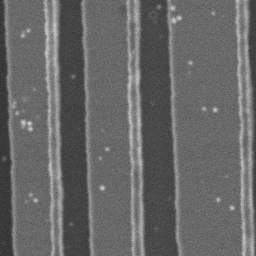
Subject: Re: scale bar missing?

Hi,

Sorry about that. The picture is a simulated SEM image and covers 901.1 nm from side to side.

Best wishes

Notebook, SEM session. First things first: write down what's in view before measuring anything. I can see lines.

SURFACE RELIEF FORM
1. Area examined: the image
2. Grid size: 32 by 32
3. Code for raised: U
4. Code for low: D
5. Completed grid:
DUUUUUUDDDUUUUUUUDDDDUUUUUUUUUUD
DUUUUUUDDDUUUUUUUDDDDUUUUUUUUUUD
DUUUUUUDDDUUUUUUUDDDDUUUUUUUUUUD
DUUUUUUDDDDUUUUUUDDDDUUUUUUUUUUD
DUUUUUUDDDUUUUUUUDDDDUUUUUUUUUUD
DUUUUUUDDDUUUUUUUDDDDUUUUUUUUUUD
DUUUUUUDDDDUUUUUUDDDDUUUUUUUUUUD
DUUUUUUDDDDUUUUUUDDDDUUUUUUUUUUD
DUUUUUUDDDDUUUUUUDDDDUUUUUUUUUUD
DUUUUUUDDDDUUUUUUDDDDUUUUUUUUUUD
DUUUUUUDDDDUUUUUUDDDDUUUUUUUUUUD
DUUUUUUDDDDUUUUUUDDDDDUUUUUUUUUD
DUUUUUUDDDDUUUUUUDDDDDUUUUUUUUUD
DUUUUUUDDDDUUUUUUDDDDDUUUUUUUUUD
DUUUUUUDDDDUUUUUUDDDDDUUUUUUUUUD
DUUUUUUDDDDUUUUUUDDDDDUUUUUUUUUD
DUUUUUUDDDDUUUUUUDDDDDUUUUUUUUUD
DUUUUUUDDDDUUUUUUDDDDDUUUUUUUUUD
DUUUUUUDDDDUUUUUUUDDDDUUUUUUUUUD
DUUUUUUDDDDUUUUUUUDDDDUUUUUUUUUD
DDUUUUUDDDDUUUUUUUDDDDUUUUUUUUUD
DUUUUUUDDDDUUUUUUUDDDDUUUUUUUUUD
DDUUUUUUDDDUUUUUUUDDDDUUUUUUUUUD
DDUUUUUUDDDUUUUUUUDDDDUUUUUUUUUD
DDUUUUUUDDDUUUUUUUDDDDUUUUUUUUUD
DDUUUUUUDDDUUUUUUUDDDDUUUUUUUUUU
DDUUUUUUDDDUUUUUUUDDDDUUUUUUUUUU
DDUUUUUUDDDUUUUUUUDDDDUUUUUUUUUU
DDUUUUUUDDDUUUUUUUDDDDUUUUUUUUUU
DDUUUUUUDDDUUUUUUUDDDDUUUUUUUUUU
DDUUUUUUDDDUUUUUUUDDDDUUUUUUUUUU
DDUUUUUUDDDUUUUUUUDDDDUUUUUUUUUU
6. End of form